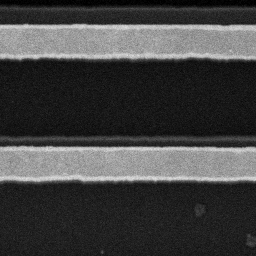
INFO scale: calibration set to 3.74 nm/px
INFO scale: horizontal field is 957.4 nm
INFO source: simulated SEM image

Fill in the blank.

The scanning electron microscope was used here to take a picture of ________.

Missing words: lines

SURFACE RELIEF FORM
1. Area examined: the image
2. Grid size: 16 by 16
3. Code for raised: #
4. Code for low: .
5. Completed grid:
##..............
################
################
################
................
................
................
................
................
################
################
................
................
................
................
................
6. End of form